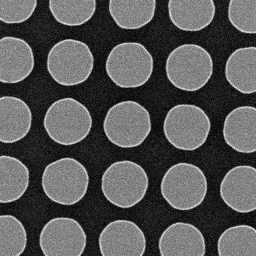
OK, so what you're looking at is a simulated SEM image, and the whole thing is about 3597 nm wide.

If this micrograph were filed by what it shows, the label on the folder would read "an array of small figures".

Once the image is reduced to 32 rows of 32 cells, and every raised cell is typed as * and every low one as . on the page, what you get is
****..******..*****..******..***
****..******..*****..******..***
***....****...*****..*****...***
...............**......**.....**
................................
***....****....**...............
****..*****...****....****...***
****..******.******..*****...***
****..******.******..*****..****
***....****...*****..*****..****
........**.....***....****...***
..............................**
***.....*.......................
****..*****...****....***.....**
****..*****..******..*****...***
****..*****..******..*****..****
***...*****..******..*****..****
**.....***....****...*****..****
......................**.....***
................................
***...****....***.....**........
****..*****..*****...****....***
***..******..*****..******..****
***..******..*****..******..****
***...****...*****..******..****
........*.....***....****...****
..............................*.
**.....**.......................
***...****...****....***.....***
***..******..*****..*****...****
***..******.******..******.*****
***..*****...*****..******.*****